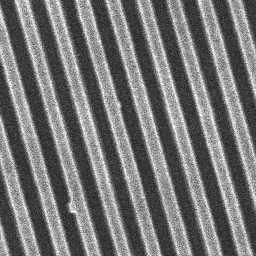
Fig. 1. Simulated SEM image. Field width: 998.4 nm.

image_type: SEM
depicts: parallel lines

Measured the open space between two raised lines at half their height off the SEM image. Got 0.0526 µm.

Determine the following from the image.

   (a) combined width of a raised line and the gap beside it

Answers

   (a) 0.114 microns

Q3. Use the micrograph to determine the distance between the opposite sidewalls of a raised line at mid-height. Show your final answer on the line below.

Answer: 0.0601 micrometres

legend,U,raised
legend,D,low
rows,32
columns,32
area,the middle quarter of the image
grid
UUUUDDDUUUUDDDDUUUUDDDUUUUDDDDUU
UUUUDDDUUUUDDDDUUUUDDDDUUUUDDDUU
UUUUDDDDUUUUDDDUUUUDDDDUUUUDDDDU
DUUUDDDDUUUUDDDDUUUUDDDUUUUDDDDU
DUUUUDDDUUUUDDDDUUUUDDDDUUUDDDDU
DUUUUDDDDUUUUDDDUUUUDDDDUUUUDDDU
DUUUUDDDDUUUUDDDDUUUUDDDUUUUDDDD
DDUUUUDDDUUUUDDDDUUUUDDDDUUUDDDD
DDUUUUDDDUUUUDDDDUUUUDDDDUUUUDDD
DDUUUUDDDDUUUUDDDUUUUDDDDUUUUDDD
DDDUUUDDDDUUUUDDDDUUUUDDDUUUUDDD
DDDUUUUDDDUUUUDDDDUUUUDDDUUUUUDD
DDDUUUUDDDDUUUDDDDUUUUDDDDUUUUDD
DDDUUUUDDDDUUUUDDDDUUUDDDDUUUUDD
DDDDUUUUDDDUUUUDDDDUUUUDDDUUUUUD
DDDDUUUUDDDUUUUDDDDUUUUDDDDUUUUD
UDDDUUUUDDDDUUUUDDDUUUUDDDDUUUUD
UDDDUUUUDDDDUUUUDDDUUUUUDDDUUUUD
UDDDDUUUUDDDUUUUDDDDUUUUDDDUUUUU
UUDDDUUUUDDDDUUUDDDDUUUUDDDDUUUU
UUDDDUUUUDDDDUUUUDDDUUUUDDDDUUUU
UUDDDDUUUUDDDUUUUDDDDUUUUDDDUUUU
UUDDDDUUUUDDDUUUUDDDDUUUUDDDDUUU
UUUDDDUUUUDDDDUUUUDDDUUUUDDDDUUU
UUUDDDUUUUDDDDUUUUDDDDUUUUDDDUUU
UUUDDDDUUUUDDDUUUUDDDDUUUUDDDDUU
UUUUDDDUUUUDDDDUUUDDDDUUUUDDDDUU
UUUUDDDUUUUDDDDUUUUDDDDUUUDDDDUU
UUUUDDDDUUUUDDDUUUUDDDDUUUUDDDUU
UUUUDDDDUUUUDDDUUUUDDDDUUUUDDDDU
UUUUUDDDUUUUDDDDUUUUDDDUUUUDDDDU
DUUUUDDDUUUUDDDDUUUUDDDUUUUUDDDU